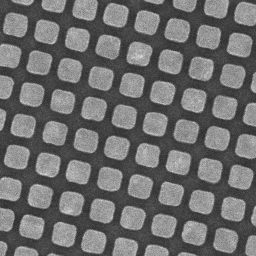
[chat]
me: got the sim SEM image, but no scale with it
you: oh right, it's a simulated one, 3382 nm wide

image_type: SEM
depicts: a regular array of raised bodies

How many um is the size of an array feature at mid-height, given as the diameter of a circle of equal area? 0.326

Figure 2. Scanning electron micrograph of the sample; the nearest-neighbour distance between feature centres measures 0.417 micrometres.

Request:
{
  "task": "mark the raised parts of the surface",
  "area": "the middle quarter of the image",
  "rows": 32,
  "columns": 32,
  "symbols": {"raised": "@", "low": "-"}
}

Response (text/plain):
@@@@--------------------@@@@@---
@@@@---@@@@@------------@@@@@--@
@@@@---@@@@@---@@--------------@
@@@@--@@@@@@---@@@@@------------
--@---@@@@@@--@@@@@@---@@@------
-------@@@@@--@@@@@@--@@@@@-----
----------@---@@@@@@--@@@@@@--@@
@@-------------@@@@---@@@@@@--@@
@@@---@@--------------@@@@@---@@
@@---@@@@@------------@@@@@--@@@
@@---@@@@@@--@@@-------------@@@
@@---@@@@@---@@@@@-------------@
----@@@@@@--@@@@@@---@@@--------
-----@@@@@--@@@@@@--@@@@@@------
------------@@@@@@--@@@@@@--@@@@
-------------@@@@---@@@@@@--@@@@
@---@@--------------@@@@@---@@@@
@--@@@@@-------------@@@@---@@@@
---@@@@@@--@@@--------------@@@@
---@@@@@---@@@@@-------------@@@
---@@@@@--@@@@@@---@@@@---------
----@@@@--@@@@@@--@@@@@@--------
----------@@@@@@--@@@@@@--@@@@@-
------------@@@---@@@@@@--@@@@@@
--@@--------------@@@@@@--@@@@@@
-@@@@@@--------------@@---@@@@@-
-@@@@@@--@@@@-------------@@@@@-
-@@@@@---@@@@@---------------@--
-@@@@@---@@@@@---@@@@-----------
--@@@@--@@@@@@---@@@@@----------
---------@@@@@--@@@@@@--@@@@@---
-----------@@---@@@@@@--@@@@@@--